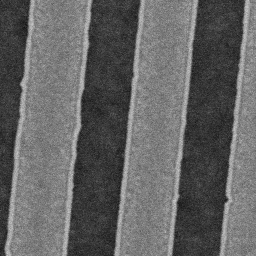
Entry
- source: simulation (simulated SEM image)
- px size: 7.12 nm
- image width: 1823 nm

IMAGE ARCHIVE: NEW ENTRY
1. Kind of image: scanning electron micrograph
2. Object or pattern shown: one or a few lines or trenches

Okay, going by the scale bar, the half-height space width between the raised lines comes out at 366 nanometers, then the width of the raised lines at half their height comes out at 391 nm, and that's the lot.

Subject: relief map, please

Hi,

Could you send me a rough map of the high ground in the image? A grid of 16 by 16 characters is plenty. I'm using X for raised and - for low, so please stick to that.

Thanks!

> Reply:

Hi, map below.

--XXXX---XXX---X
--XXX----XXX---X
--XXX----XXX---X
--XXX----XXX---X
--XXX---XXXX---X
-XXXX---XXXX---X
-XXXX---XXXX---X
-XXXX---XXXX---X
-XXXX---XXX----X
-XXXX---XXX----X
-XXX----XXX---XX
-XXX----XXX---XX
-XXX----XXX---XX
-XXX----XXX---XX
-XXX---XXXX---XX
XXXX---XXXX---XX